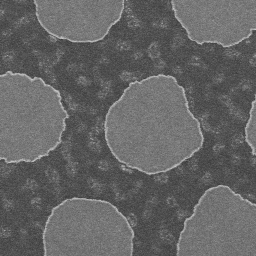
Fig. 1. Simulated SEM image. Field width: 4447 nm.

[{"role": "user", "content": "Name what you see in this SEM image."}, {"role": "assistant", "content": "raised bodies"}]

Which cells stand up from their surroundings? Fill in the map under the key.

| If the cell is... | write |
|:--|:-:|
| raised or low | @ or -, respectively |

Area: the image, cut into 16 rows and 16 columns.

--@@@@@@---@@@@@
---@@@@----@@@@@
----@@------@@@-
----------------
----------------
@@@-----@@@-----
@@@@---@@@@@----
@@@@---@@@@@----
@@@@---@@@@@@--@
@@@----@@@@@----
--------@@@-----
----------------
----@@------@@@-
---@@@@@----@@@@
---@@@@@---@@@@@
---@@@@@---@@@@@